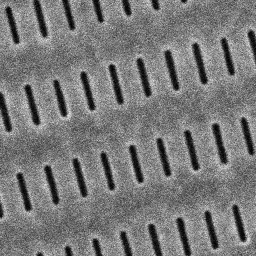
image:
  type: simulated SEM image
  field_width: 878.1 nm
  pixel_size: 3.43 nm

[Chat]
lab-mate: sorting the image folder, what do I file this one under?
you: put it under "a regular array of holes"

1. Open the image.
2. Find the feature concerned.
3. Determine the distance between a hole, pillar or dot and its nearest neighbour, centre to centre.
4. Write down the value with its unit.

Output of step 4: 98.4 nm